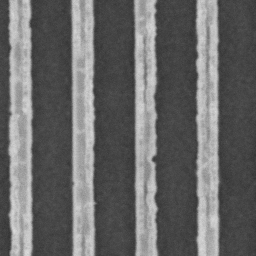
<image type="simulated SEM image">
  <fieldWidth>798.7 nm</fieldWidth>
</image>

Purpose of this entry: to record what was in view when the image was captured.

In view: one or a few lines or trenches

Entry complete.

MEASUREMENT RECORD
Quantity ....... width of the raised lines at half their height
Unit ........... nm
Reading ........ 54.6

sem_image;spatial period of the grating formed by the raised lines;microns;0.195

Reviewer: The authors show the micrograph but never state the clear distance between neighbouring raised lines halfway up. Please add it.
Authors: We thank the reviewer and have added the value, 141 nanometers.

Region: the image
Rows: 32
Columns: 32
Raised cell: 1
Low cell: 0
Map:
01110000011000000110000001100000
01110000011000000110000001100000
01110000011100000110000001100000
01110000011100000110000001100000
00110000011000000110000001100000
01110000011000000110000001100000
00110000011000000110000001100000
01110000011000000110000001100000
00110000011000000110000001100000
00110000011100000110000001100000
00110000011000000110000001100000
00110000011000000110000001100000
00110000011000000110000001100000
00110000011000000110000001100000
00110000011000000110000001100000
01110000011100000110000001100000
00110000011100000110000001100000
00110000011100000110000001100000
00110000011100000110000001100000
00110000011000000110000001100000
00110000011000000110000001100000
01110000011000000110000001100000
00110000011000000110000001100000
00110000011000000110000001100000
00110000011000000110000001100000
00110000011000000110000001100000
00110000011000000110000001100000
00110000011000000110000001100000
00110000011000000110000001100000
00110000001000000110000001100000
00110000011000000110000001100000
01110000011000000110000001100000